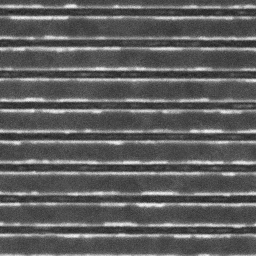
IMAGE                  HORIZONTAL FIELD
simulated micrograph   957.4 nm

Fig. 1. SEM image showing parallel lines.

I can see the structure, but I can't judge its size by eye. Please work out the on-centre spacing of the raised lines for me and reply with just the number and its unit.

116 nm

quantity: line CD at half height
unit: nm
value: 84.6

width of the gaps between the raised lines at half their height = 30.4 nm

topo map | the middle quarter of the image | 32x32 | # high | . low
################################
.................###############
................................
................................
################################
################################
################################
################################
################################
................................
................................
................................
################################
################################
################################
################################
################################
................................
................................
################################
################################
################################
################################
################################
################################
................................
................................
################################
################################
################################
################################
################################